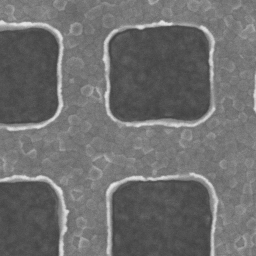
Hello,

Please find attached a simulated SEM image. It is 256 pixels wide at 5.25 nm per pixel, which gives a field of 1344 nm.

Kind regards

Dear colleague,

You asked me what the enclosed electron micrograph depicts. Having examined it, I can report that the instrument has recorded holes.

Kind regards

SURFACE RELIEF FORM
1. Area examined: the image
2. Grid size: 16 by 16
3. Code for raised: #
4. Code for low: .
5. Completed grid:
################
################
....###......###
....###......###
....###......###
....###......###
....###......###
...#####....####
################
################
################
...#####.....###
....###......###
....###......###
....###......###
....###......###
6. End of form